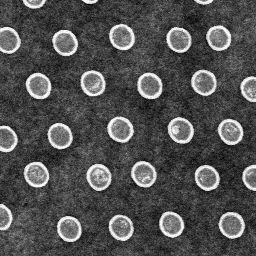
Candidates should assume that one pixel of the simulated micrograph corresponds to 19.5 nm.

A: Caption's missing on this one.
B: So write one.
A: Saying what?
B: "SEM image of a regular array of raised bodies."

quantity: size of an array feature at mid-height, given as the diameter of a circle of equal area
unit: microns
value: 0.456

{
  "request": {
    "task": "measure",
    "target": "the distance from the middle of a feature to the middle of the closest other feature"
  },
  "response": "966 nm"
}